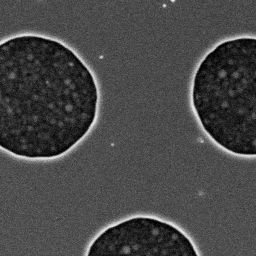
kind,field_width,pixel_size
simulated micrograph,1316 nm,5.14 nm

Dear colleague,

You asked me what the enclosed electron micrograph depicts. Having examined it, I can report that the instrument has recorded holes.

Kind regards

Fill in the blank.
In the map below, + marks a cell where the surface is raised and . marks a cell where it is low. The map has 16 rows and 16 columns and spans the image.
++++++++++++++++
++++++++++++++++
+..++++++++++++.
.....++++++++...
......++++++....
......++++++....
......++++++....
......++++++....
.....++++++++...
+...+++++++++++.
++++++++++++++++
++++++++++++++++
++++++++++++++++
++++++++++++++++
++++++.....+++++
++++++......++++